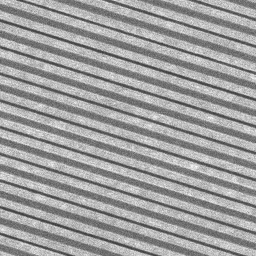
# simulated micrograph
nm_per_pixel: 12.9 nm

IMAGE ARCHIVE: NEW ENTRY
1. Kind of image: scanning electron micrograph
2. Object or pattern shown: parallel lines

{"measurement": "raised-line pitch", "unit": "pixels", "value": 12.7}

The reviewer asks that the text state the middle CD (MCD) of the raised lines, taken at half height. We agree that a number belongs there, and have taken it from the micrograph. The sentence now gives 105 nm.